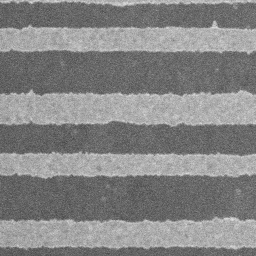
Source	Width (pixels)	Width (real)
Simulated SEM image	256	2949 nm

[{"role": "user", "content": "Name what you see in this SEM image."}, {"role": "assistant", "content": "one or a few lines or trenches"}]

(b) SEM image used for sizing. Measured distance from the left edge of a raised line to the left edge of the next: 746 nm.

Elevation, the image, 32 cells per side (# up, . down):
..............###...............
................................
................................
...#.................##...#.....
################################
################################
................................
................................
................................
................................
................................
..............................#.
################################
################################
################################
...................#.#..#..#....
................................
................................
................................
#############################..#
################################
################################
................................
................................
................................
................................
................................
........#..................###..
################################
################################
################################
................................